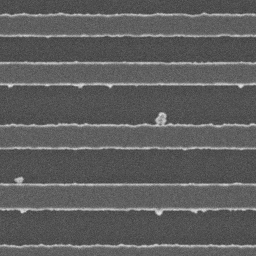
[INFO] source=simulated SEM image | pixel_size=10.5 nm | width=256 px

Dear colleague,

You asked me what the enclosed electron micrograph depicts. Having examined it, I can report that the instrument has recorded lines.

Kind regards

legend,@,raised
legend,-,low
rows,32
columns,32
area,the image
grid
--------------------------------
--------------------------------
@@@@@@@@@@@@@@@@@@@@@@@@@@@@@@@@
@@@@@@@@@@@@@@@@@@@@@@@@@@@@@@@@
@@@@@@@@@@@@@@@@@@@@@@@@@@@@@@@@
--------------------------------
--------------------------------
--------------------------------
@@@@@@@@@@@@@@@@@@@@@@@@@@@@@@@@
@@@@@@@@@@@@@@@@@@@@@@@@@@@@@@@@
@@@@@@@@@@@@@@@@@@@@@@@@@@@@@@@@
--------------------------------
--------------------------------
--------------------------------
--------------------------------
-------------------@@-----------
@@@@@@@@@@@@@@@@@@@@@@@@@@@@@@@@
@@@@@@@@@@@@@@@@@@@@@@@@@@@@@@@@
@@@@@@@@@@@@@@@@@@@@@@@@@@@@@@@@
--------------------------------
--------------------------------
--------------------------------
--------------------------------
@@@@@@@@@@@@@@@@@@@@@@@@@@@@@@@@
@@@@@@@@@@@@@@@@@@@@@@@@@@@@@@@@
@@@@@@@@@@@@@@@@@@@@@@@@@@@@@@@@
-------------------@------------
--------------------------------
--------------------------------
--------------------------------
--------------------------------
@@@@@@@@@@@@@@@@@@@@@@@@@@@@@@@@